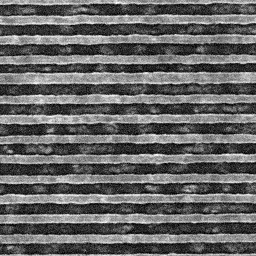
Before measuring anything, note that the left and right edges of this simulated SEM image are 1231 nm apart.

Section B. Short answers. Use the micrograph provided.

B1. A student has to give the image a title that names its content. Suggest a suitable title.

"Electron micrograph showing parallel lines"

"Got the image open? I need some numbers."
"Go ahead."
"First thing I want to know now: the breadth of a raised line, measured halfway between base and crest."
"39.1 nm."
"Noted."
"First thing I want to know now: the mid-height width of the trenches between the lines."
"57.1 nm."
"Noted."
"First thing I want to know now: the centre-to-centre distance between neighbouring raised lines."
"95.7 nanometres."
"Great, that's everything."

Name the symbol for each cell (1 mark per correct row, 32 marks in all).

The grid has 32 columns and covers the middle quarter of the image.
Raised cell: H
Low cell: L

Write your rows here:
LLLLLLLLLLLLLLLLLLLLLLLLLLLLLLLL
LLLLLLLLLLLLLLLLLLLLLLLLLLLLLLLL
HLHHLLLHHHHHLLHLLLLHHHHHHHHHHHHH
HHHHHHHHHHHHHHHHHHHHHHHHHHHHHHHH
HHHHHHHHHHHHHHHHHHHHHHHHHHHHHHHL
LLLLLLLLLLLLLLLLLLLLLLLLLLLLLLLL
LLLLLLLLLLLLLLLLLLLLLLLLLLLLLLLL
LLLLLLLLLLLLLLLLLLLLLLLLLLLLLLLL
HHHHHHHHHHHHHHHHHHHHHHHHHHHHHHHH
HHHHHHHHHHHHHHHHHHHHHHHHHHHHHHHH
LLLLLLLLLLLLLLLLLLLLLLLLLLLLLLLL
LLLLLLLLLLLLLLLLLLLLLLLLLLLLLLLL
LLLLLLLLLLLLLLLLLLLLLLLLLLLLLLLL
HHHHHHHHHHHHHHHHHHHHHHHHHHHHHHHH
HHHHHHHHHHHHLLHHHHHHHHHHHHHHHHHH
LLLLLLLLLLLLLLLLLLLLLLLLLLLLLLLL
LLLLLLLLLLLLLLLLLLLLLLLLLLLLLLLL
LLLLLLLLLLLLLLLLLLLLLLLLLLLLLLLL
HHHHHHHHHHHHHHHHHHHHHHHHHHHHHHHH
HHHHHHHHHHHHHHHLLHHHHHHHHHHHHHHH
LLLLLLLLLLLLLLLLLLLLLLLLLLLLLLLL
LLLLLLLLLLLLLLLLLLLLLLLLLLLLLLLL
LLLLLLLLLLLLLLLLLLLLLLLLLLLLLLLL
HHHHHHHHHHHHHHHHHHHHHHHHHHHHHHHH
HHHHHHHHHHHHHHHHHHHHHHHHHHHHHHHH
LLLLLLLLLLLLLLLLLLLLLLLLLLLLLLLL
LLLLLLLLLLLLLLLLLLLLLLLLLLLLLLLL
LLLLLLLLLLLLLLLLLLLLLLLLLLLLLLLL
HHHHHHHHHHHHHHHHHHHHHHHHHHHHHHHH
LHHHHHHHHLLLHHHHHHHHHHHHHHHHHHHL
LLLLLLLLLLLLLLLLLLLLLLLLLLLLLLLL
LLLLLLLLLLLLLLLLLLLLLLLLLLLLLLLL